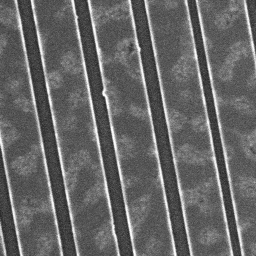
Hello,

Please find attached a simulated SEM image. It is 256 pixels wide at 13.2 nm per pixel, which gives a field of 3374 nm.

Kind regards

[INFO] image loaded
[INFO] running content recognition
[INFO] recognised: parallel lines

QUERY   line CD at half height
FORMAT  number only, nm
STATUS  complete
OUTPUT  540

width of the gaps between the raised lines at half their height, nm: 190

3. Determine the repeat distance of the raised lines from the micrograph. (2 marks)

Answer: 734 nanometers